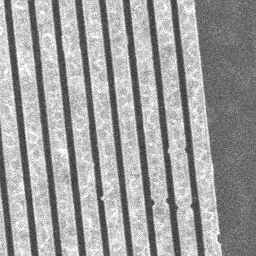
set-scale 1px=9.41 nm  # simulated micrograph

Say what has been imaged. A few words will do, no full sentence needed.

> parallel lines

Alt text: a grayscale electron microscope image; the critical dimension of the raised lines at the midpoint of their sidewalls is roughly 145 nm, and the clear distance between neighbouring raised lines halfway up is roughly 81.8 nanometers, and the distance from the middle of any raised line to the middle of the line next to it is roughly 222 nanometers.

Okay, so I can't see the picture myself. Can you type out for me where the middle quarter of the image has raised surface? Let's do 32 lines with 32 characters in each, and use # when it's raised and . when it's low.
.###...###..####...###..####..##
.###...###...###...###..####...#
.###...####..###...###...###...#
.####..####..###...###...###...#
.####..####..####..###...####..#
.####..####..####..####..####..#
.####..####..####..####..####..#
.####..####..####..####..####..#
..###..####..####..####..####..#
..###...###..####..####..####..#
..###...###...###...###..####...
..###...###...###...###...###...
..####..####..###...###...###...
..####..####..####..###...####..
..####..####..####..####..####..
..####..####..####..####..####..
..####..####..####..####..####..
...###..####..####..####..####..
...###...###..####..####..####..
...###...###..####...###..####..
#..###...###...###...###...###..
#..###...####..###...###..####..
#..####..####..####..###..####..
#..####..####..####..####..####.
#..####..####..####..####..####.
#..####..####..####..####..####.
#...###..####..####..####..####.
#...###...###..####..####..####.
#...###...###..####...###..####.
##..####..###...###...###...###.
##..####..####..###...###...###.
##..####..####..####..###...###.